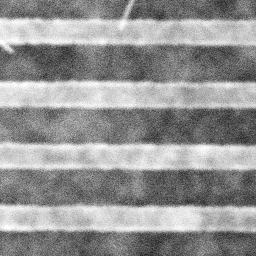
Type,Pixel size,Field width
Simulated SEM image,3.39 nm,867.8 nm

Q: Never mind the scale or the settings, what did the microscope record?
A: lines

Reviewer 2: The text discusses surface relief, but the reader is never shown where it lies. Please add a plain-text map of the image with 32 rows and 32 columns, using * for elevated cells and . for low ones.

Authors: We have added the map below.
................................
................................
................................
********************************
********************************
................................
................................
................................
................................
................................
************************.*******
********************************
********************************
................................
................................
................................
................................
................................
********************************
********************************
********************************
................................
................................
................................
................................
................................
********************************
********************************
********************************
................................
................................
................................